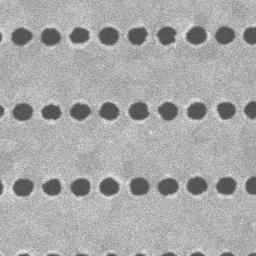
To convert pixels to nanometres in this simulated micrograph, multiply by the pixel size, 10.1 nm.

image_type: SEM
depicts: a regular array of holes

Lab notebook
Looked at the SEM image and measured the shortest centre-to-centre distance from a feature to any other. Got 290 nm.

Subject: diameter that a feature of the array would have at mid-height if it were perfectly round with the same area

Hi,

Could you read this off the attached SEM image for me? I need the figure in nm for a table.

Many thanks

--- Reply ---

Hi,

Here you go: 197